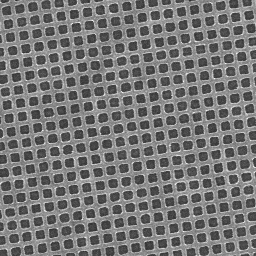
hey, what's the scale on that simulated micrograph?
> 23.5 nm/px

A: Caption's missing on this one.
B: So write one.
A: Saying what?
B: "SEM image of a regular array of holes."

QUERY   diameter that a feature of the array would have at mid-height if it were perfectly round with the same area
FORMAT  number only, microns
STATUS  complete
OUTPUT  0.243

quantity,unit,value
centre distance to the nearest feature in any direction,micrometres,0.308